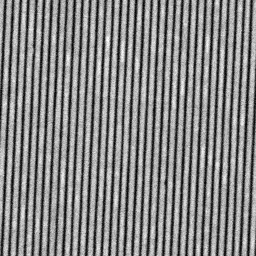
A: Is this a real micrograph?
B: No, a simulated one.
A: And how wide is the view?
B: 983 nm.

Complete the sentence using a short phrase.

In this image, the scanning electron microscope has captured parallel lines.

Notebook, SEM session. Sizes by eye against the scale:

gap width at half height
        10.1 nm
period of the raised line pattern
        29.5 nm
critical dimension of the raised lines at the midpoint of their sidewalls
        0.0206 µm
